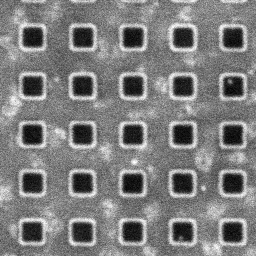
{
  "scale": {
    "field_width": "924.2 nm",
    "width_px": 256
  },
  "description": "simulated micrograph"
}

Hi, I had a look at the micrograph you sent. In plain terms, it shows a regular array of raised bodies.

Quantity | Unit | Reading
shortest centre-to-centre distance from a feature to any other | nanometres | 176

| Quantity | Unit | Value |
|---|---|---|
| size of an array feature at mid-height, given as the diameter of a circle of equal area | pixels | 28.2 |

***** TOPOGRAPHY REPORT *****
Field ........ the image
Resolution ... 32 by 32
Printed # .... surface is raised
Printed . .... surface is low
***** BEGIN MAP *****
................................
................................
................................
...##....###...###...###....###.
...###...###...###...###....###.
...###...###...###...###....###.
................................
................................
................................
...##....###...###....##....##..
...###...###...###...###....###.
...###...###...###...###....###.
................................
................................
................................
...##....###...###....##....##..
..####...###...###...###....###.
..####...###...###...###....###.
................................
................................
................................
...##....##....###....##....##..
..####...###...###...###....###.
...###...###...###...###....###.
................................
................................
................................
...##....##.....#...............
..####...###...###...###....###.
..####...###...###...###....###.
...##....##.....##....##....##..
................................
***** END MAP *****